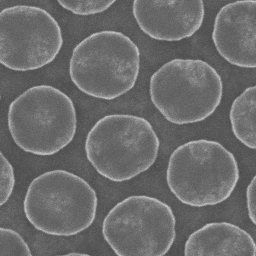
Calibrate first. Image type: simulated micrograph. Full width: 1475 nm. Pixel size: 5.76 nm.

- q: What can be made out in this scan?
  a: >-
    raised bodies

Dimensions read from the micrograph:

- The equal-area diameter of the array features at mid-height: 391 nanometres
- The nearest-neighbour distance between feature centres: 483 nm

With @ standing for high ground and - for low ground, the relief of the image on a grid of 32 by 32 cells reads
--------@@@@@@---@@@@@@@@----@@@
@@@@@@---@@@-----@@@@@@@@--@@@@@
@@@@@@@----------@@@@@@@@--@@@@@
@@@@@@@-----------@@@@@@@--@@@@@
@@@@@@@@---@@@@@---@@@@@---@@@@@
@@@@@@@@--@@@@@@@----------@@@@@
@@@@@@@--@@@@@@@@----------@@@@@
@@@@@@---@@@@@@@@-----@-----@@@@
-@@@@----@@@@@@@@---@@@@@@------
---------@@@@@@@@--@@@@@@@@-----
----------@@@@@@@--@@@@@@@@@----
---@@@@----@@@@@---@@@@@@@@@---@
--@@@@@@@----------@@@@@@@@--@@@
-@@@@@@@@-----------@@@@@@@--@@@
-@@@@@@@@-----@@-----@@@@@---@@@
-@@@@@@@@---@@@@@@@----------@@@
-@@@@@@@@--@@@@@@@@----------@@@
--@@@@@@@--@@@@@@@@@----------@@
---@@@@@---@@@@@@@@@--@@@@@@----
-----------@@@@@@@@@-@@@@@@@@---
@-----------@@@@@@@--@@@@@@@@---
@@----@@----@@@@@@---@@@@@@@@@--
@@--@@@@@@-----------@@@@@@@@@--
@---@@@@@@@----------@@@@@@@@--@
@--@@@@@@@@@----------@@@@@@---@
---@@@@@@@@@---@@@@@----@@-----@
---@@@@@@@@@--@@@@@@@----------@
----@@@@@@@@-@@@@@@@@@----------
-----@@@@@@--@@@@@@@@@----@@@@--
@@-----------@@@@@@@@@--@@@@@@@-
@@@-----------@@@@@@@--@@@@@@@@@
@@@@-----------@@@@@@--@@@@@@@@@